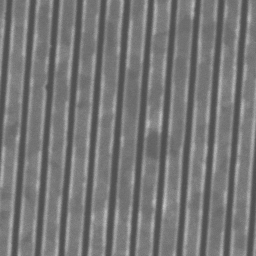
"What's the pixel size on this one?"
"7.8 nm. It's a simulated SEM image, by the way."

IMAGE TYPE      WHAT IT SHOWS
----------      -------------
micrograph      parallel lines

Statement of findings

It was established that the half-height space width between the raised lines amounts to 57.4 nm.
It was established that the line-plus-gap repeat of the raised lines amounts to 183 nanometers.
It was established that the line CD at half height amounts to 122 nm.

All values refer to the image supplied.